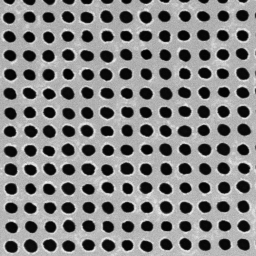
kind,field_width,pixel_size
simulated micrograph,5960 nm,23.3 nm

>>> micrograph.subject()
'a regular array of holes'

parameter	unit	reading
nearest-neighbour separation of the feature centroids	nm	434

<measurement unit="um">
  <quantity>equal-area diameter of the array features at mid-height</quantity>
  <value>0.283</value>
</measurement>